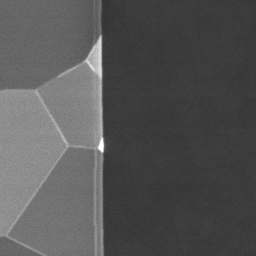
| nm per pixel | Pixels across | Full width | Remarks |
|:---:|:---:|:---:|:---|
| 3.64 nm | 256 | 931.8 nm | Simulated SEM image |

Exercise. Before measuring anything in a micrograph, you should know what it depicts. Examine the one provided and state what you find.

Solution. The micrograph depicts wiring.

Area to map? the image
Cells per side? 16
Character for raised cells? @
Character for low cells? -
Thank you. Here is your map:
@@@@@@----------
@@@@@@----------
@@@@@@----------
@@@@@@----------
@@@@@@----------
@@@@@@----------
@@@@@@----------
@@@@@@----------
@@@@@@----------
@@@@@@----------
@@@@@@----------
@@@@@@----------
@@@@@@----------
@@@@@@----------
@@@@@@----------
@@@@@@----------